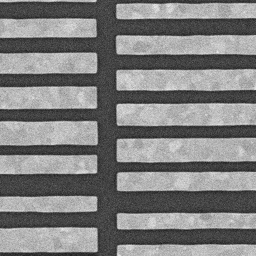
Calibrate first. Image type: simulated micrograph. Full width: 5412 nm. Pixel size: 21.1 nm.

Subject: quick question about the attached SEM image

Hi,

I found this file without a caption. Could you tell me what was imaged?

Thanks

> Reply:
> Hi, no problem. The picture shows groups of lines, slits or small figures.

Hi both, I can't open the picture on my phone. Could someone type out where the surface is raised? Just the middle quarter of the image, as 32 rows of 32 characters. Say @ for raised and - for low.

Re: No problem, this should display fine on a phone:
@@@@@@@@------------------------
@@@@@@@@------------------------
-------------@@@@@@@@@@@@@@@@@@@
-------------@@@@@@@@@@@@@@@@@@@
-------------@@@@@@@@@@@@@@@@@@@
-------------@@@@@@@@@@@@@@@@@@@
@@@@@@@@------------------------
@@@@@@@@------------------------
@@@@@@@@------------------------
@@@@@@@@------------------------
@@@@@@@@-----@@@@@@@@@@@@@@@@@@@
-------------@@@@@@@@@@@@@@@@@@@
-------------@@@@@@@@@@@@@@@@@@@
-------------@@@@@@@@@@@@@@@@@@@
-------------@@@@@@@@@@@@@@@@@@@
@@@@@@@@------------------------
@@@@@@@@------------------------
@@@@@@@@------------------------
@@@@@@@@------------------------
@@@@@@@@-----@@@@@@@@@@@@@@@@@@@
-------------@@@@@@@@@@@@@@@@@@@
-------------@@@@@@@@@@@@@@@@@@@
-------------@@@@@@@@@@@@@@@@@@@
@@@@@@@@-----@@@@@@@@@@@@@@@@@@@
@@@@@@@@------------------------
@@@@@@@@------------------------
@@@@@@@@------------------------
--------------@@@@@@@@@@@@@@@@@@
-------------@@@@@@@@@@@@@@@@@@@
-------------@@@@@@@@@@@@@@@@@@@
-------------@@@@@@@@@@@@@@@@@@@
--------------@@@@@------------@